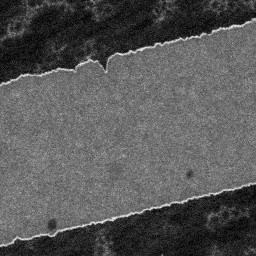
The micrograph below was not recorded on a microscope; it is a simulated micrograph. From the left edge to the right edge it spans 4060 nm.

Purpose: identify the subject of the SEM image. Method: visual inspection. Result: one or a few lines or trenches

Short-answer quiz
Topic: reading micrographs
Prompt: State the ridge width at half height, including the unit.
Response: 2500 nanometers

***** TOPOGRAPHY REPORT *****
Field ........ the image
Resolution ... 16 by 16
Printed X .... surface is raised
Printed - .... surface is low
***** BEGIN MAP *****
----------------
---------------X
-----------XXXXX
-------XXXXXXXXX
---XXXXXXXXXXXXX
XXXXXXXXXXXXXXXX
XXXXXXXXXXXXXXXX
XXXXXXXXXXXXXXXX
XXXXXXXXXXXXXXXX
XXXXXXXXXXXXXXXX
XXXXXXXXXXXXXXXX
XXXXXXXXXXXXXXXX
XXXXXXXXXXXX----
XXXXXXXX--------
XXXX------------
----------------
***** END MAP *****